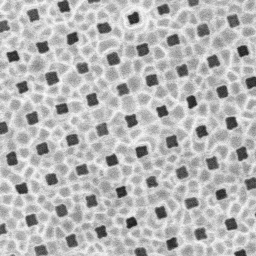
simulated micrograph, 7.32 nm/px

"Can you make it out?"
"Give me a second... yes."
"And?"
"a regular array of holes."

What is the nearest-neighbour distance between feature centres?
227 nm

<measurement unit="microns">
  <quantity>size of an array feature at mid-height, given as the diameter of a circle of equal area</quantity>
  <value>0.0949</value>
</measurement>